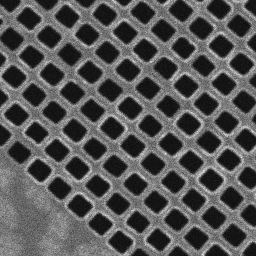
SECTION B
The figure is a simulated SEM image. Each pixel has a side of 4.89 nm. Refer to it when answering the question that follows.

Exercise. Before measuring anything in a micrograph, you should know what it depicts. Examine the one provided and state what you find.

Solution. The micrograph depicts a regular array of holes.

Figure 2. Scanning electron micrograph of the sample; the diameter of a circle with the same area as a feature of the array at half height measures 0.105 um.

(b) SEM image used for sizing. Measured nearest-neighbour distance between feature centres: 130 nanometres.